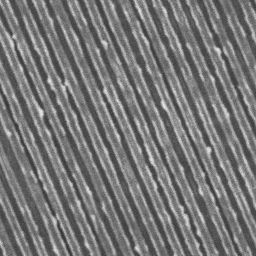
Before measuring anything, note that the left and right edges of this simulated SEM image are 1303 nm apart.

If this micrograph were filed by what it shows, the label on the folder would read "parallel lines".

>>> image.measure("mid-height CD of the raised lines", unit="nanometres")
46.9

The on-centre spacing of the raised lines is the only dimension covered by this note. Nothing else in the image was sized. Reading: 79.4 nanometres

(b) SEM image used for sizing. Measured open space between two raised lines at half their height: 34 nm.